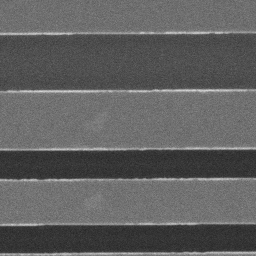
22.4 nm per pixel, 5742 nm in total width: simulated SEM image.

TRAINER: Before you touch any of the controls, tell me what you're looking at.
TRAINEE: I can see lines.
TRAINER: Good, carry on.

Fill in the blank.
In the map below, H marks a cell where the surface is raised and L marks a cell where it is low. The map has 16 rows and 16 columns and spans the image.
HHHHHHHHHHHHHHHH
HHHHHHHHHHHHHHHH
LLLLLLLLLLLLLLLL
LLLLLLLLLLLLLLLL
LLLLLLLLLLLLLLLL
LLLLLLLLLLLLLLLL
HHHHHHHHHHHHHHHH
HHHHHHHHHHHHHHHH
HHHHHHHHHHHHHHHH
LLLLLLLLLLLLLLLL
LLLLLLLLLLLLLLLL
HHHHHHHHHHHHHHHH
HHHHHHHHHHHHHHHH
HHHHHHHHHHHHHHHH
LLLLLLLLLLLLLLLL
LLLLLLLLLLLLLLLL